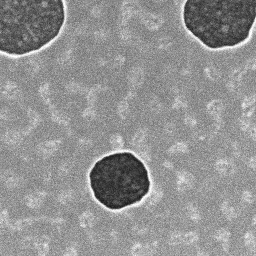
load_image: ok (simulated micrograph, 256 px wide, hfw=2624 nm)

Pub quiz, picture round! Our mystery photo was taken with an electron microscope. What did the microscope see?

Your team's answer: holes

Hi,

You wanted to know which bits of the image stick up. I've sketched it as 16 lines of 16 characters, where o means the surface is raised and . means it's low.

....oooooooo....
....oooooooo....
...ooooooooo...o
oooooooooooooooo
oooooooooooooooo
oooooooooooooooo
oooooooooooooooo
oooooooooooooooo
oooooooooooooooo
oooooooooooooooo
oooooo...ooooooo
oooooo...ooooooo
oooooo...ooooooo
oooooooooooooooo
oooooooooooooooo
oooooooooooooooo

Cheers